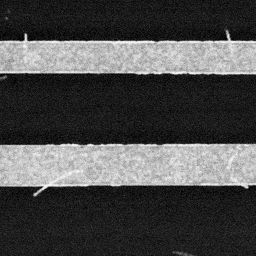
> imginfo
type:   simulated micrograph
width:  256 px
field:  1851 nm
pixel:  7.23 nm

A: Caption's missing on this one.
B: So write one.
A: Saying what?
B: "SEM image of lines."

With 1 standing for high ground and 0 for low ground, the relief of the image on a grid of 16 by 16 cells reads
0000000000000000
0000000000000000
0000000000000000
1111111111111111
1111111111111111
0000000000000000
0000000000000000
0000000000000000
0000000000000000
1111111111111111
1111111111111111
1111111111111111
0000000000000000
0000000000000000
0000000000000000
0000000000000000